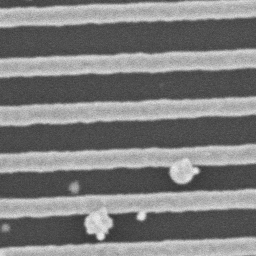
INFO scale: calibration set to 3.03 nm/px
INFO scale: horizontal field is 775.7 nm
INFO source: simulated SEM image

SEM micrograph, lines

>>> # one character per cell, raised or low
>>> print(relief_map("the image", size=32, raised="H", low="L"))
LLLLLLLLLLLLLLLLHHHHHHHHHHHHHHHH
HHHHHHHHHHHHHHHHHHHHHHHHHHHHHHHH
HHHHHHHHHHHHHHHHHHHHHHLLLLLLLLLL
LLLLLLLLLLLLLLLLLLLLLLLLLLLLLLLL
LLLLLLLLLLLLLLLLLLLLLLLLLLLLLLLL
LLLLLLLLLLLLLLLLLLLLLLLLLLLLLLLL
LLLLLLLLLLLLLLLLLLLLLLLLLLHHHHHH
HHHHHHHHHHHHHHHHHHHHHHHHHHHHHHHH
HHHHHHHHHHHHHHHHHHHHHHHHHHHHHHHL
HHLLLLLLLLLLLLLLLLLLLLLLLLLLLLLL
LLLLLLLLLLLLLLLLLLLLLLLLLLLLLLLL
LLLLLLLLLLLLLLLLLLLLLLLLLLLLLLLL
LLLLLLLLLLLLLLLLLLLLHLLHHHHHHHHH
HHHHHHHHHHHHHHHHHHHHHHHHHHHHHHHH
HHHHHHHHHHHHHHHHHHHHHHHHHLLLLLLL
HHHHLLLLLLLLLLLLLLLLLLLLLLLLLLLL
LLLLLLLLLLLLLLLLLLLLLLLLLLLLLLLL
LLLLLLLLLLLLLLLLLLLLLLLLLLLLLLLL
LLLLLLLLLLLLLLLLLLLLLLLLHHHHHHHH
HHHHHHHHHHHHHHHHHHHHHHHHHHHHHHHH
HHHHHHHHHHHHHHHHHHHHHHHHHHHHLLLL
LLLLLLLLLLLLLLLLLLLLLHHHHLLLLLLL
LLLLLLLLLLLLLLLLLLLLLLHHLLLLLLLL
LLLLLLLLLLLLLLLLLLLLLLLLLLLLLLLL
LLLLLLLLLLHHHHHHHHHHHHHHHHHHHHHH
HHHHHHHHHHHHHHHHHHHHHHHHHHHHHHHH
HHHHHHHHHHHHHHHHLHHLLLLLLLLLLLLL
LLLLLLLLLLLHHHLLLLLLLLLLLLLLLLLL
LLLLLLLLLLLHHHLLLLLLLLLLLLLLLLLL
LLLLLLLLLLLLHLLLLLLLLLLLLLLLLLLL
LLLLLLLLLLLLLHHHHHHHHHHHHHHHHHHH
HHHHHHHHHHHHHHHHHHHHHHHHHHHHHHHH